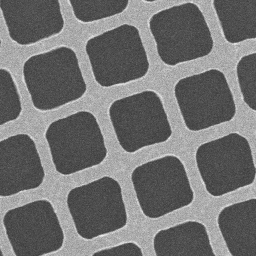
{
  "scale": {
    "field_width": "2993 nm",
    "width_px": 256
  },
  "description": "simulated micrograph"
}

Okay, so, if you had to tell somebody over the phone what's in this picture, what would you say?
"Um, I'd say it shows a regular array of holes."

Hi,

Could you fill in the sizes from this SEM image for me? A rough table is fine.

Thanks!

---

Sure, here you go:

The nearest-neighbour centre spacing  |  789 nm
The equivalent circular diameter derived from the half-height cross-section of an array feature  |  700 nanometres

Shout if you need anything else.